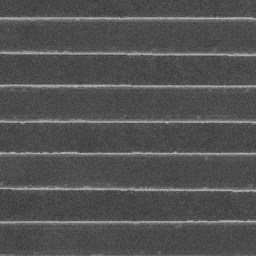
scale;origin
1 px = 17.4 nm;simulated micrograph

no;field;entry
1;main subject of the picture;lines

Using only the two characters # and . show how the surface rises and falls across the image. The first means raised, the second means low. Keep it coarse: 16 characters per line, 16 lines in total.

................
################
################
................
................
################
################
################
................
................
################
################
................
................
################
################